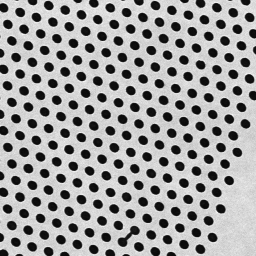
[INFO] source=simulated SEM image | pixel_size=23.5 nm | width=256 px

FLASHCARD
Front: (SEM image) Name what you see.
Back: a regular array of holes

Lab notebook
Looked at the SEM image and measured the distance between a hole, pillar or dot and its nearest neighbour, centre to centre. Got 396 nm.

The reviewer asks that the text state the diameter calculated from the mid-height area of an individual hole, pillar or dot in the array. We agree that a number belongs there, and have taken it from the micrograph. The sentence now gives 230 nanometers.